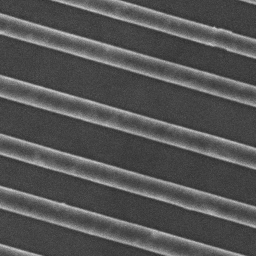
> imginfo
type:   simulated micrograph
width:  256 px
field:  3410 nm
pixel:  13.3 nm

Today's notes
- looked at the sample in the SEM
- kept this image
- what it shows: parallel lines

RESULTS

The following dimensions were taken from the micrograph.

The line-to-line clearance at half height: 35.6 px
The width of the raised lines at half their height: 259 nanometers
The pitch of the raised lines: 727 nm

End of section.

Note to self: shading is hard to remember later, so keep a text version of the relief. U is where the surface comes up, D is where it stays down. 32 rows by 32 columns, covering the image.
DDDDDDDDUUUUUUUUUDDDDDDDDDDDDDDD
DDDDDDDDDDDDUUUUUUUUDDDDDDDDDDDD
UUUDDDDDDDDDDDDUUUUUUUUDDDDDDDDD
UUUUUUDDDDDDDDDDDDDUUUUUUUUDDDDD
DUUUUUUUUUDDDDDDDDDDDDUUUUUUUUDD
DDDDDUUUUUUUUDDDDDDDDDDDDDUUUUUU
DDDDDDDDUUUUUUUUUDDDDDDDDDDDDUUU
DDDDDDDDDDDDUUUUUUUUDDDDDDDDDDDD
DDDDDDDDDDDDDDDUUUUUUUUUDDDDDDDD
DDDDDDDDDDDDDDDDDDDUUUUUUUUDDDDD
UUUUDDDDDDDDDDDDDDDDDDUUUUUUUUUD
UUUUUUUDDDDDDDDDDDDDDDDDDDUUUUUU
DUUUUUUUUUUDDDDDDDDDDDDDDDDDDUUU
DDDDDUUUUUUUUUDDDDDDDDDDDDDDDDDD
DDDDDDDDDUUUUUUUUUDDDDDDDDDDDDDD
DDDDDDDDDDDDUUUUUUUUUDDDDDDDDDDD
DDDDDDDDDDDDDDDDUUUUUUUUUDDDDDDD
UUDDDDDDDDDDDDDDDDDUUUUUUUUUDDDD
UUUUUUDDDDDDDDDDDDDDDDDUUUUUUUUU
DUUUUUUUUDDDDDDDDDDDDDDDDDUUUUUU
DDDDUUUUUUUUUDDDDDDDDDDDDDDDDDUU
DDDDDDDDUUUUUUUUDDDDDDDDDDDDDDDD
DDDDDDDDDDDUUUUUUUUUDDDDDDDDDDDD
UDDDDDDDDDDDDDDUUUUUUUUDDDDDDDDD
UUUUDDDDDDDDDDDDDDUUUUUUUUUDDDDD
UUUUUUUUDDDDDDDDDDDDDDUUUUUUUUUD
DDUUUUUUUUUDDDDDDDDDDDDDDUUUUUUU
DDDDDUUUUUUUUUUDDDDDDDDDDDDDDUUU
DDDDDDDDDUUUUUUUUUDDDDDDDDDDDDDD
DDDDDDDDDDDDUUUUUUUUUUDDDDDDDDDD
DDDDDDDDDDDDDDDDUUUUUUUUUDDDDDDD
UUUDDDDDDDDDDDDDDDDUUUUUUUUUUDDD